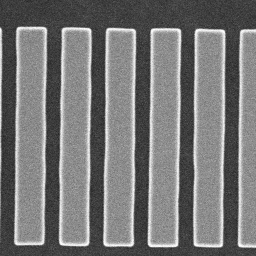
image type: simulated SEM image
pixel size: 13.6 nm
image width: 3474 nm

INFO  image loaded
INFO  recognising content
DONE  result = groups of lines, slits or small figures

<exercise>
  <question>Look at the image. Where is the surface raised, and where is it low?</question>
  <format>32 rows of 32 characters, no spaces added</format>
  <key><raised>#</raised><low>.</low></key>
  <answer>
................................
................................
................................
..###...........................
..####..###..####..####.####..##
..####..###..####..####.####..##
..####..###..####..####.####..##
..####..###..####..####.####..##
..####..###..####..###..####..##
..####..###..####..###..####..##
..####..###..####..###..####..##
..####..###..####..###..####..##
..####..###..####..###..####..##
..####..###..####..###..####..##
..####..###..####..###..####..##
..####..###..####..###..####..##
..####..###..####..###..####..##
..####..###..####..###..####..##
..####..###..####..###..####..##
..####..###..####..###..####..##
..####.####..####..###..####..##
..####.####..####..###..####..##
..####.####..####..###..####..##
..####..###..####..###..####..##
..###...###..####..###..####..##
..###..####..####..###..####..##
..###..####..####..###..####..##
..###..####..####..###..####..##
..###..####..####..###..####..##
..###..####..####..###..####..##
..###...###..####..###..####..##
................................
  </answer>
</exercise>